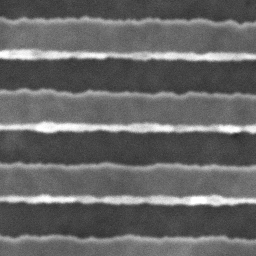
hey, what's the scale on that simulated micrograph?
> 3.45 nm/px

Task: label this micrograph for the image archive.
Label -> lines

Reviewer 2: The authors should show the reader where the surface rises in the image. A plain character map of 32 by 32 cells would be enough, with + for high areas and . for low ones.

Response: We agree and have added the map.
................................
................................
+.+++++++++++.....++....++......
++++++++++++++++++++++++++++++++
++++++++++++++++++++++++++++++++
++++++++++++++++++++++++++++++++
++++++++++++++++++++++++++++++++
........................+..+....
................................
................................
................................
+++++++....+....................
++++++++++++++++++++++++++++++++
++++++++++++++++++++++++++++++++
++++++++++++++++++++++++++++++++
++++++++++++++++++++++++++++++++
...............................+
................................
................................
................................
+++.........++......+...........
++++++++++++++++++++++++++++++++
++++++++++++++++++++++++++++++++
++++++++++++++++++++++++++++++++
++++++++++++++++++++++++++++++++
.....................+.+..++....
................................
................................
................................
...+..++........+...............
++++++++++++++++++++++++++++++++
++++++++++++++++++++++++++++++++